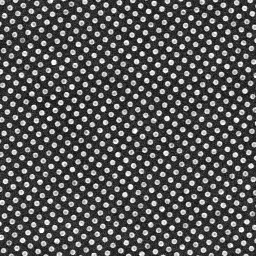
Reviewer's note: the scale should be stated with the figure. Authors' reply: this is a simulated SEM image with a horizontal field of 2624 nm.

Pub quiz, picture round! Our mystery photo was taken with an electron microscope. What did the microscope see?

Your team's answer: a regular array of raised bodies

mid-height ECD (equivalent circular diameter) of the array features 47.7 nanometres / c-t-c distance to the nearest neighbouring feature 97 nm